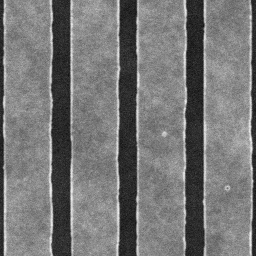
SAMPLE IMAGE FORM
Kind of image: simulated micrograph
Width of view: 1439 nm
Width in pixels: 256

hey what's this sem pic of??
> lines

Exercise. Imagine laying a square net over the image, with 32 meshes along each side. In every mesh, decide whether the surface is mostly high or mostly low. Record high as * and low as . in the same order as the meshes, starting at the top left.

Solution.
.*****...******..******...*****.
.******..******..******...*****.
*******..******..******...*****.
.*****...******..******...*****.
.******..******..******...*****.
.******..******..******...*****.
.******..******..******...*****.
.******..******..******...*****.
.*****...******..******...*****.
.*****...******..******...*****.
.*****...******..******...*****.
.*****...******..******...*****.
*******..******..******...*****.
*******..******..******...*****.
******...******..******...*****.
******...******..******...*****.
******...******..******...*****.
.*****...******..******...*****.
.*****...******..******...*****.
.*****...******..******...*****.
.*****...******..******...*****.
.*****...******..******...*****.
.*****...******..******...******
.*****...******..******...*****.
.*****...******..******...*****.
.******..******..******...*****.
.******..******..******...*****.
.******..******..******...*****.
.******..******..******...*****.
.******..******..******...*****.
.*****...******..******...*****.
.******..******..******...*****.